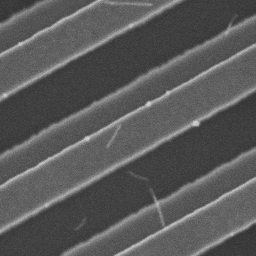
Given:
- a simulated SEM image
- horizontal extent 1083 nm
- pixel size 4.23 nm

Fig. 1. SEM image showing lines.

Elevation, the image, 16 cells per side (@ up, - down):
--@@@@@@@@------
@@@@@@@@@------@
@@@@@@@------@@@
@@@@@------@@@@@
@@@-------@@@@@@
@-------@@@@@@@@
------@@@@@@@@--
----@@@@@@@@@---
--@@@@@@@@@-----
-@@@@@@@@-------
@@@@@@@-------@@
@@@@@-------@@@@
@@@@------@@@@@@
@@------@@@@@@@@
-------@@@@@@@@-
-----@@@@@@@@---